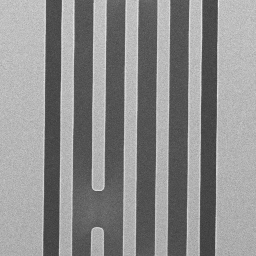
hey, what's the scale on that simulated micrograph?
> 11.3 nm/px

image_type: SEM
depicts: groups of lines, slits or small figures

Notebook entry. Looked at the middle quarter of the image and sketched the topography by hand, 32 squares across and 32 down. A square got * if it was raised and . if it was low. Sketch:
**.....***.....***.....***.....*
**.....***.....***.....***.....*
**.....***.....***.....***.....*
**.....***.....***.....***.....*
**.....***.....***.....***.....*
**.....***.....***.....***.....*
**.....***.....***.....***.....*
**.....***.....***.....***.....*
**.....***.....***.....***.....*
**.....***.....***.....***.....*
**.....***.....***.....***.....*
**.....***.....***.....***.....*
**.....***.....***.....***.....*
**.....***.....***.....***.....*
**.....***.....***.....***.....*
**.....***.....***.....***.....*
**.....***.....***.....***.....*
**.....***.....***.....***.....*
**.....***.....***.....***.....*
**.....***.....***.....***.....*
**.....***.....***.....***.....*
**.....***.....***.....***.....*
**.....***.....***.....***.....*
**.....***.....***.....***.....*
**.....***.....***.....***.....*
**.....***.....***.....***.....*
**.....***.....***.....***.....*
**.....***.....***.....***.....*
**.....***.....***.....***.....*
**.....***.....***.....***.....*
**.....***.....***.....***.....*
**......**.....***.....***.....*